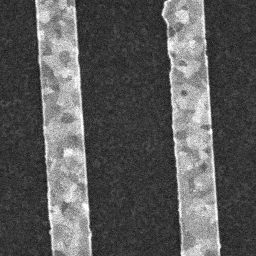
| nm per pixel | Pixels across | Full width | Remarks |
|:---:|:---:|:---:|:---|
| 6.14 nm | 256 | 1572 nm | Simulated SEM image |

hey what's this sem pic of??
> one or a few lines or trenches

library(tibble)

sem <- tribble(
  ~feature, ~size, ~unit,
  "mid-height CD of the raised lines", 0.232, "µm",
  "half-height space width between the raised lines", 560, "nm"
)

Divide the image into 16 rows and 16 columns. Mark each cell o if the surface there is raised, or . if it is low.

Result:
..ooo.....ooo...
..ooo.....ooo...
..ooo.....ooo...
..ooo......oo...
...oo......oo...
...oo......oo...
...oo......oo...
...oo......oo...
...oo......oo...
...oo......oo...
...oo......oo...
...oo......oo...
...oo......oo...
...ooo.....ooo..
...ooo.....ooo..
...ooo.....ooo..